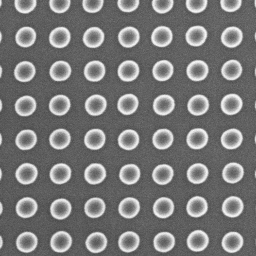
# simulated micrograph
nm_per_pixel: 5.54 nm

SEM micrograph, a regular array of raised bodies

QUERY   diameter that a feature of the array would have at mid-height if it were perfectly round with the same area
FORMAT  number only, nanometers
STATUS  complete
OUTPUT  111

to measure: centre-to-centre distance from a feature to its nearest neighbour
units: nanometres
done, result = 186